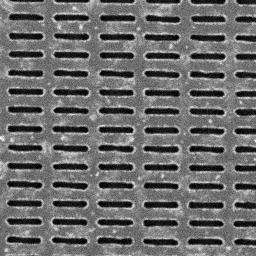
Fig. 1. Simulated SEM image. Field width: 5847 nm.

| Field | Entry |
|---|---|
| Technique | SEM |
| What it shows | a regular array of holes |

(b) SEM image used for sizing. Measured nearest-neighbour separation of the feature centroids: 0.419 um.